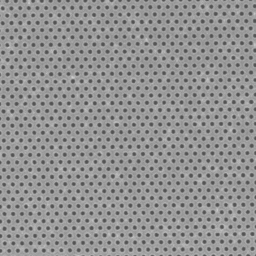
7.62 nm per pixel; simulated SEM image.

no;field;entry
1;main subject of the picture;a regular array of holes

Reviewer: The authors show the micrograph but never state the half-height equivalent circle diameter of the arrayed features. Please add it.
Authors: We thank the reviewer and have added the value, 33.3 nm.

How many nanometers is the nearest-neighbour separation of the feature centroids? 61.8